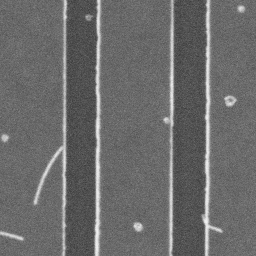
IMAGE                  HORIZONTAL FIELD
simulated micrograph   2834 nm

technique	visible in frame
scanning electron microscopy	lines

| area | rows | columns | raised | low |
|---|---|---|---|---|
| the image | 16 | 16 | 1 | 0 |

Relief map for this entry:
1111001111100111
1111001111100111
1111001111100111
1111001111100111
1111001111100111
1111001111100111
1111001111100111
1111001111100111
1111001111100111
1111001111100111
1111001111100111
1111001111100111
1111001111100111
1111001111100111
1111001111100111
1111001111100111